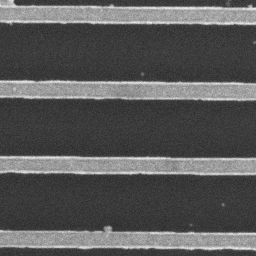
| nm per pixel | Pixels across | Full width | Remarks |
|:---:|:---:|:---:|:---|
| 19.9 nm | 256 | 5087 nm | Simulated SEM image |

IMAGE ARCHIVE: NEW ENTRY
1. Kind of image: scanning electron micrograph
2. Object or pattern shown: lines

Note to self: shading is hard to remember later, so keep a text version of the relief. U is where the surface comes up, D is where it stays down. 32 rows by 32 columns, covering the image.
UDDDDDDDDDDDDDDDDDDDDDDDDDDDDDDD
UUUUUUUUUUUUUUUUUUUUUUUUUUUUUUUU
UUUUUUUUUUUUUUUUUUUUUUUUUUUUUUUU
DDDDDDDDDDDDDDDDDDDDDDDDDDDDDDDD
DDDDDDDDDDDDDDDDDDDDDDDDDDDDDDDD
DDDDDDDDDDDDDDDDDDDDDDDDDDDDDDDD
DDDDDDDDDDDDDDDDDDDDDDDDDDDDDDDD
DDDDDDDDDDDDDDDDDDDDDDDDDDDDDDDD
DDDDDDDDDDDDDDDDDDDDDDDDDDDDDDDD
DDDDDDDDDDDDDDDDDDDDDDDDDDDDDDDD
UUUUUUUUUUUUUUUUUUUUUUUUUUUUUUDD
UUUUUUUUUUUUUUUUUUUUUUUUUUUUUUUU
DDDDDDDDDDDDDDDDDDDDDDDDDDDDDDDD
DDDDDDDDDDDDDDDDDDDDDDDDDDDDDDDD
DDDDDDDDDDDDDDDDDDDDDDDDDDDDDDDD
DDDDDDDDDDDDDDDDDDDDDDDDDDDDDDDD
DDDDDDDDDDDDDDDDDDDDDDDDDDDDDDDD
DDDDDDDDDDDDDDDDDDDDDDDDDDDDDDDD
DDDDDDDDDDDDDDDDDDDDDDDDDDDDDDDD
DDDDDDDDDDDDDDDDDDDDDDDDDDDDDDDD
UUUUUUUUUUUUUUUUUUUUUUUUUUUUUUUU
UDUUUUUUUUUUUUUUUUUUUUUUUUUUUUUU
DDDDDDDDDDDDDDDDDDDDDDDDDDDDDDDD
DDDDDDDDDDDDDDDDDDDDDDDDDDDDDDDD
DDDDDDDDDDDDDDDDDDDDDDDDDDDDDDDD
DDDDDDDDDDDDDDDDDDDDDDDDDDDDDDDD
DDDDDDDDDDDDDDDDDDDDDDDDDDDDDDDD
DDDDDDDDDDDDDDDDDDDDDDDDDDDDDDDD
DDDDDDDDDDDDDDDDDDDDDDDDDDDDDDDD
UUUUUUUUUUUUUUUUUUUUUUUUUUUUUUUU
UUUUUUUUUUUUUUUUUUUUUUUUUUUUUUUU
DDDDDDDDDDDDDDDDDDDDDDDDDDDDDDDD